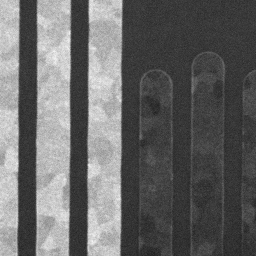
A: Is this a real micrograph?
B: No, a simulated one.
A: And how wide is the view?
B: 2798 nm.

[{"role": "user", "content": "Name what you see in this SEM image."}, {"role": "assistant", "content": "groups of lines, slits or small figures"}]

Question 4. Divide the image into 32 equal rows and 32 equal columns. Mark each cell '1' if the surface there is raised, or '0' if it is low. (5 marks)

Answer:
11000111100111100000000000000000
11000111100111100000000000000000
11000111100111100000000000000000
11000111100111100000000000000000
11000111100111100000000000000000
11000111100111100000000000000000
11000111100111100000000000000000
11000111100111100000000011110000
11000111100111100000000011110000
11000111100111100011100011110001
11000111100111100011100011110011
11000111100111100011100011110011
11000111100111100011100011110011
11000111100111100011100011110011
11000111100111100011100011110011
11000111100111100011100011110011
11000111100111100011100011110011
11000111100111100011100011110011
11000111100111100011100011110011
11000111100111100011100011110011
11000111100111100011100011110011
11000111100111100011100011110011
11000111100111100011100011110011
11000111100111100011110011110011
11000111100111100011110011110011
11000111100111100011100011110011
11000111100111100011100011110011
11000111100111100011100011110011
11000111000111100011100011110011
11000111000111100011100011110011
11000111000111100111100011110011
11000111000111100111100011110011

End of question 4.